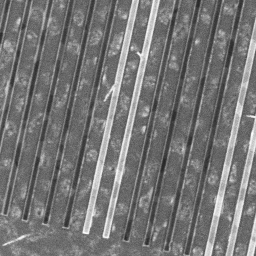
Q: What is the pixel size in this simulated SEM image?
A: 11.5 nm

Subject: parallel lines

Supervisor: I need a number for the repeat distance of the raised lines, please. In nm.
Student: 238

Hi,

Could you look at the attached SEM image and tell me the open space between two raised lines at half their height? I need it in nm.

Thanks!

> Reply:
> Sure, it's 170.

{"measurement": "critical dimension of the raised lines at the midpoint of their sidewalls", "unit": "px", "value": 5.99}